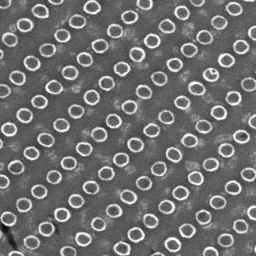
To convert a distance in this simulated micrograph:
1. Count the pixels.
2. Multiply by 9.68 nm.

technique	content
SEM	a regular array of raised bodies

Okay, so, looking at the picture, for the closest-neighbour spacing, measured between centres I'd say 0.196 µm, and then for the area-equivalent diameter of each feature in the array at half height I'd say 0.137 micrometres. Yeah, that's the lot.